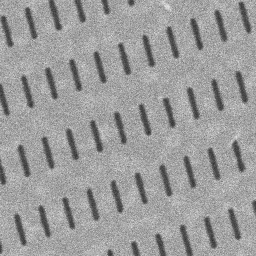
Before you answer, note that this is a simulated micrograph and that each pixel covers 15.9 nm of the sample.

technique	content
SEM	a regular array of holes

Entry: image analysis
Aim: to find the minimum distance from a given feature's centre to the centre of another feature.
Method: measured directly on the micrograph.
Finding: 406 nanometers